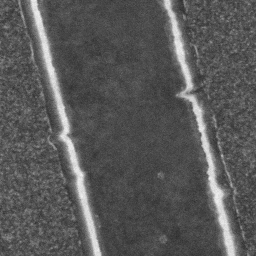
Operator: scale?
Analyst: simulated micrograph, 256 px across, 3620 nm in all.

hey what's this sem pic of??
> one or a few lines or trenches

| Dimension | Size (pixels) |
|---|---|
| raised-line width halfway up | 131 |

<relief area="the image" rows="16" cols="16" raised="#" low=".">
..#########.....
..#########.....
...########.....
...########.....
...#########....
...#########....
....########....
....#########...
....#########...
....#########...
.....########...
.....########...
.....#########..
......########..
......########..
......########..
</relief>